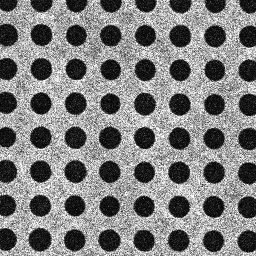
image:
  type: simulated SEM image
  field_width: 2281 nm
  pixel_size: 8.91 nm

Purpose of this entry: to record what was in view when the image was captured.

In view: a regular array of holes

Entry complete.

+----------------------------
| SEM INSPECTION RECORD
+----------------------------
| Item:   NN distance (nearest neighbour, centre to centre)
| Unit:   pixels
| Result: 34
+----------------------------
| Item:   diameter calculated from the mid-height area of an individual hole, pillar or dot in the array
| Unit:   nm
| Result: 197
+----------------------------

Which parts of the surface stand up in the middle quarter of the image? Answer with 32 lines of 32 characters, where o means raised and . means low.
......ooo.....oooo.....ooo......
......ooo.....ooo......ooo......
o.....ooo.....oooo.....ooo......
o....ooooo...ooooo....ooooo....o
oooooooooooooooooooooooooooooooo
oooooooooooooooooooooooooooooooo
oooooooooooooooooooooooooooooooo
o...ooooooo..oooooo...oooooo..oo
o....ooooo....oooo.....oooo....o
......ooo.....ooo......ooo......
......ooo.....ooo......ooo......
o....ooooo....oooo.....oooo.....
oo..oooooo...oooooo...oooooo..oo
oooooooooooooooooooooooooooooooo
oooooooooooooooooooooooooooooooo
ooooooooooo.oooooooooooooooooooo
o....oooo.....oooo....ooooo....o
.....oooo.....oooo.....ooo.....o
......ooo.....ooo......ooo......
.....oooo.....oooo.....ooo.....o
o....oooo.....oooo....ooooo....o
ooooooooooo.oooooooooooooooooooo
oooooooooooooooooooooooooooooooo
oooooooooooooooooooooooooooooooo
o...oooooo...oooooo..ooooooo..oo
.....oooo.....oooo....oooo.....o
......ooo.....ooo......ooo.....o
......ooo.....ooo......ooo......
.....oooo.....oooo....oooo.....o
o...oooooo...oooooo...ooooo...oo
oooooooooooooooooooooooooooooooo
oooooooooooooooooooooooooooooooo